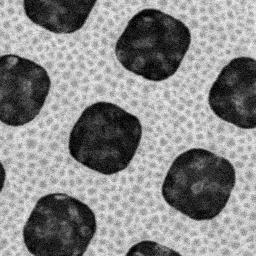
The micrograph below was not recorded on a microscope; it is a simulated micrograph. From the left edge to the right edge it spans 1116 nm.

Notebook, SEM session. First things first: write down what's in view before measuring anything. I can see holes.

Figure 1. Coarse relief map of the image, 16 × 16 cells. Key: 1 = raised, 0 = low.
1100001111111111
1100011100001111
1111111000001111
0111111000001111
0001111100011100
0001111111111000
0001110111111000
0011100001111100
1111000001111111
1111000001100111
1111100011100001
1111111111000001
1100011111000011
1100001111110111
1000001111111111
1100011100011111